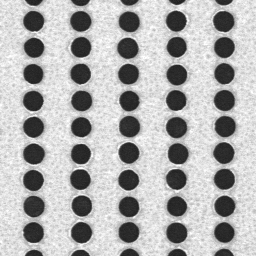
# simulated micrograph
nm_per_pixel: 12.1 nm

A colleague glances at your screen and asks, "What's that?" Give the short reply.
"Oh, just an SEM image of a regular array of holes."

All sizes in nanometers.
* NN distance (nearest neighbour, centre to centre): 314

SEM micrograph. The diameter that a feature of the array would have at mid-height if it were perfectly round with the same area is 253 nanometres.